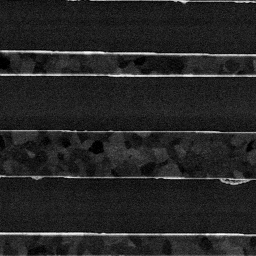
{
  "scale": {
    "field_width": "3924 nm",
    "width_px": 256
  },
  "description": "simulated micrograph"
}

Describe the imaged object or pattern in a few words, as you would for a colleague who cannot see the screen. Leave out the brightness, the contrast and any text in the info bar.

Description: lines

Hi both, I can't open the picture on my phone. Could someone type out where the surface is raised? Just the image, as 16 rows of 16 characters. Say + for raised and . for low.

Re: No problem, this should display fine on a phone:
................
................
................
++++++++++++++++
++++++++++++++++
................
................
................
++++++++++++++++
++++++++++++++++
++++++++++++++++
................
................
................
................
++++++++++++++++